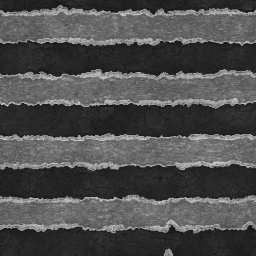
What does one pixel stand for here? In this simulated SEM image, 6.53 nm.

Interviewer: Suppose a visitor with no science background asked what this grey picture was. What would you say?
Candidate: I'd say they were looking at one or a few lines or trenches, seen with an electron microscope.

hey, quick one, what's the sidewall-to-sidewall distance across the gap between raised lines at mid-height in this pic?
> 203 nm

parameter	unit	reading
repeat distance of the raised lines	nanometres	407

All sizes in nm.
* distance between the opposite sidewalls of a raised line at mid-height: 210